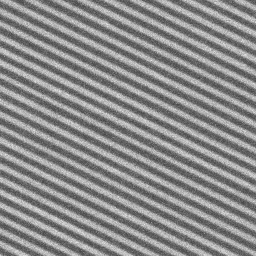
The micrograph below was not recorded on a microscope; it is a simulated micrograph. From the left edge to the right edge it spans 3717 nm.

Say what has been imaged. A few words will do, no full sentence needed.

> parallel lines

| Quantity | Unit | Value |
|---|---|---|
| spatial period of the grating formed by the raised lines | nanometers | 168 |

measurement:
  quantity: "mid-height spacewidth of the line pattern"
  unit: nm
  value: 114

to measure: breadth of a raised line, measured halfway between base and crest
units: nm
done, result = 63.4